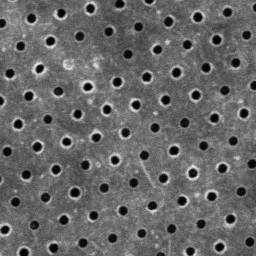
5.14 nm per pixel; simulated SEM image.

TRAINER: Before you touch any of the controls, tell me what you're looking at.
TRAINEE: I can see a regular array of holes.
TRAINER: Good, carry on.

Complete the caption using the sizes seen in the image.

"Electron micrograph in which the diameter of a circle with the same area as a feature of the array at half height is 0.0516 micrometres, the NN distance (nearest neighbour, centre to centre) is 151 nanometres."